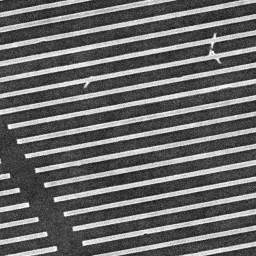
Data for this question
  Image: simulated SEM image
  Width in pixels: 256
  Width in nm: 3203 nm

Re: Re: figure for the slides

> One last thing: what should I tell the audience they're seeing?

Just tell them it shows parallel lines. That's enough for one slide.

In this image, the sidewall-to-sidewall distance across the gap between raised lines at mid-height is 144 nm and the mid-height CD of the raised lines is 55.3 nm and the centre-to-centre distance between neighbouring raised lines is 200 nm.